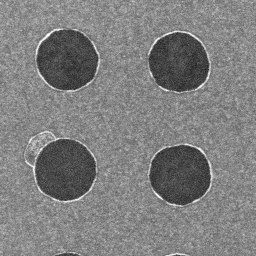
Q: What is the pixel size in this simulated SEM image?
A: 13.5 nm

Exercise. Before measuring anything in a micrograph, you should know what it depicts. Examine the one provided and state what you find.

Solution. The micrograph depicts holes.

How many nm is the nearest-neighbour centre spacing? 1480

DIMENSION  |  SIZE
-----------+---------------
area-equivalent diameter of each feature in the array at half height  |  841 nm